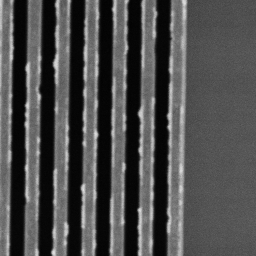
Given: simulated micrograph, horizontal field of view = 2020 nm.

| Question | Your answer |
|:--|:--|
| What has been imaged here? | parallel lines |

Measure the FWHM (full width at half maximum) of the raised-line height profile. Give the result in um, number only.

0.116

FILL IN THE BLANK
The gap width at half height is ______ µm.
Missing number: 0.108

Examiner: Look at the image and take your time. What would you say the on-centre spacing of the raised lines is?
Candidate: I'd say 226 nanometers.